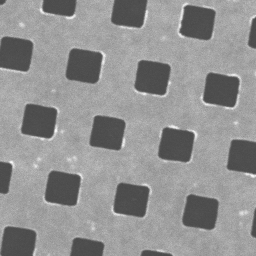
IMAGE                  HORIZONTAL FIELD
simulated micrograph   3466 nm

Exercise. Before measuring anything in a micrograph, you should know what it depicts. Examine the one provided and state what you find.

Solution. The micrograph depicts a regular array of holes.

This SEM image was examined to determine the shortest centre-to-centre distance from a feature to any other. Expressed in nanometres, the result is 943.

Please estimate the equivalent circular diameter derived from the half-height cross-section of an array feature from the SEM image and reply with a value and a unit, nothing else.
497 nm